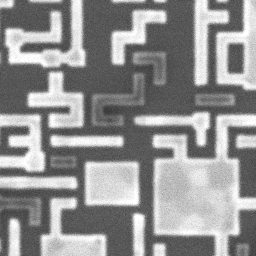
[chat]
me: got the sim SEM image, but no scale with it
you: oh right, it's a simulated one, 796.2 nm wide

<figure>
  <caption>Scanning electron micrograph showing wiring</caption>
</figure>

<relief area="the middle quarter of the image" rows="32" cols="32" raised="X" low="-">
-----------------------XX-------
-----------------------XX-------
------------------XX---XX-------
------------------XX---XX-------
------------------XX---XX-------
------------------XX------------
-----------------XXX------------
XXX--------------XXX------------
XXXXX--XXXXXXXXXXXXX------------
XXXXX--XXXXXXXXXXXXX------------
-XXXX--XXX----------------------
--XXX--XX-----------------------
--XXX--XXX----------------------
XXXXX--XXXXXXXX---XXXXXXXXXXXXXX
XXXXX--XXXXXXXX---XXXXXXXXXXXXXX
XXX-----------------------------
--------------------------------
--------------------------------
XXXX--XXXXXXXX---------XXXXXXX--
XXXXXXXXXXXXXX---------XXXXXXX--
-----------------------XXXXXXX--
----------------------------XX--
----------------------------XX--
XXX-------------------------XXX-
XXX--------------------XXXXXXXXX
XXX---XXXXXXXXXXXX-----XXXXXXXXX
------XXXXXXXXXXXX-----XXXXXXXXX
------XXXXXXXXXXXX-----XXXXXXXXX
------XXXXXXXXXXXX-----XXXXXXXXX
XXX---XXXXXXXXXXXX-----XXXXXXXXX
XXX---XXXXXXXXXXXX-----XXXXXXXXX
------XXXXXXXXXXXX-----XXXXXXXXX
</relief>